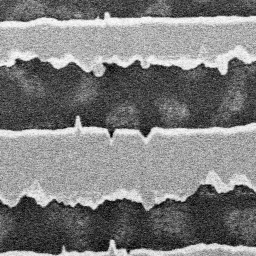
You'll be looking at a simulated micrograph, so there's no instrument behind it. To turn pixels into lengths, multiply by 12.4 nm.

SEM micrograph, one or a few lines or trenches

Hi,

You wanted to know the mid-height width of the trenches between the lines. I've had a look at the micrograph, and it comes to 63.6 px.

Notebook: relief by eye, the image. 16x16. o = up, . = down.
................
.ooooooooooooooo
oooooooooooooooo
oooooooooooooo.o
................
................
................
................
oooooooooooooooo
oooooooooooooooo
oooooooooooooooo
ooooooooooooo.oo
o..oooo..o......
................
................
............oo..